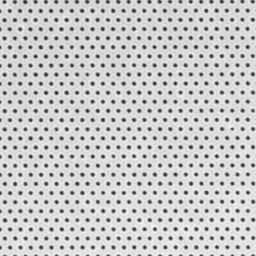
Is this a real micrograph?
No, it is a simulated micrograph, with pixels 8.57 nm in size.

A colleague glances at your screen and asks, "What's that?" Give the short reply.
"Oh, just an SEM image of a regular array of holes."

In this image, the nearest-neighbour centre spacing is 10.1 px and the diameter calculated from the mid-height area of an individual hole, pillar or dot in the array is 5.04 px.